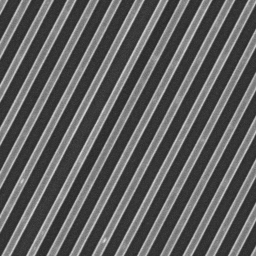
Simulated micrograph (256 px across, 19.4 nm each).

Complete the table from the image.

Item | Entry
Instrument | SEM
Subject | parallel lines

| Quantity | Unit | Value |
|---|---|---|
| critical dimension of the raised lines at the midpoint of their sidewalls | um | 0.15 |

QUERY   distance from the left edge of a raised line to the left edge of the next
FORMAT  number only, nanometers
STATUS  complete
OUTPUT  389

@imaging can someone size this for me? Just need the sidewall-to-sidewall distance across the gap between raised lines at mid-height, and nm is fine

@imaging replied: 249